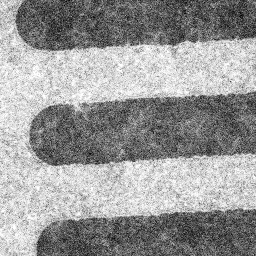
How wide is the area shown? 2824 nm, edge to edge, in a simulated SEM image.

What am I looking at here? one or a few lines or trenches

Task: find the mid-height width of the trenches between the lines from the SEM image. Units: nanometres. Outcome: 581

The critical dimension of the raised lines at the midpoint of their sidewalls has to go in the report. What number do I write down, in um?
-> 0.684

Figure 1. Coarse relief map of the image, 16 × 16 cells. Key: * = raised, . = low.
.***************
.***************
.**************.
................
................
................
...*.***********
..**************
..**************
..**************
................
................
................
.......*********
...*************
..**************